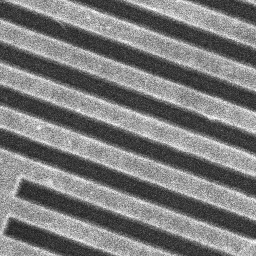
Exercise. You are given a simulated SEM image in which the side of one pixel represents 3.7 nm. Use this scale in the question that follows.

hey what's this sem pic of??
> parallel lines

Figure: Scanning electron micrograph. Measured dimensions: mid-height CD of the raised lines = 82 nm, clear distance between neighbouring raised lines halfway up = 66.4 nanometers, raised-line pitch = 149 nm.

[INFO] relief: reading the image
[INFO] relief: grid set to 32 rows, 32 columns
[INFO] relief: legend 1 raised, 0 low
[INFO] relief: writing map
00111111110000001111111110000001
00001111111110000001111111100000
00000001111111100000001111111100
11100000001111111100000001111111
11111100000001111111100000011111
01111111100000011111111100000011
00001111111100000011111111000000
00000011111111000000011111111000
11000000011111111000000111111111
11111000000011111111000000111111
11111111000000011111111000000111
00111111110000000111111110000000
00000111111110000000111111110000
10000000111111110000000111111110
11110000000111111110000001111111
11111110000000111111100000001111
01111111110000001111111100000001
00001111111100000001111111100000
00000001111111100000001111111100
11100000001111111100000001111111
11111100000011111111000000011111
11111111000000011111111000000011
11111111111000000011111111000000
11000011111111000000111111111000
11000000011111111000000111111110
11111000000111111110000000111111
11111110000000111111110000000111
10111111110000000111111110000001
10000111111110000000111111110000
10000000111111110000001111111100
11110000001111111100000001111111
11111100000001111111100000001111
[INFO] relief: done